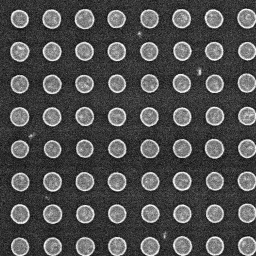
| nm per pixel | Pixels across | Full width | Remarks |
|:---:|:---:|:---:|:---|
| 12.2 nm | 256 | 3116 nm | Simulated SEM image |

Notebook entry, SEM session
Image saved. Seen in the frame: a regular array of raised bodies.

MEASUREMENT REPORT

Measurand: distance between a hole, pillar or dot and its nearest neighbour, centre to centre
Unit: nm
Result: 389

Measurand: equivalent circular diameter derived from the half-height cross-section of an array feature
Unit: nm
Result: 221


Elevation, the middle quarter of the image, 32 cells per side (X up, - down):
--------------------------------
--------------------------------
--------------------------------
---XXXX----XXXX-----XXX-----XXX-
---XXXX----XXXX----XXXXX---XXXXX
---XXXX----XXXX----XXXXX---XXXXX
---XXXX-----XXX-----XXX-----XXX-
--------------------------------
--------------------------------
--------------------------------
--------------------------------
---XXXX-----XXX-----XXX-----XXX-
---XXXX----XXXX----XXXX----XXXXX
---XXXX----XXXX----XXXXX---XXXXX
----XXX-----XXX-----XXX-----XXX-
--------------------------------
--------------------------------
--------------------------------
--------------------------------
----XX------XX------XXX-----XXX-
---XXXX----XXXX----XXXXX---XXXXX
---XXXX----XXXX----XXXXX---XXXXX
----XXX-----XXX-----XXX-----XXX-
--------------------------------
--------------------------------
--------------------------------
--------------------------------
----XX------XX------XXX-----XXX-
---XXXX----XXXX-----XXXX----XXX-
---XXXX----XXXX----XXXXX---XXXXX
---XXXX----XXXX-----XXXX----XXX-
----XX------XXX------X----------